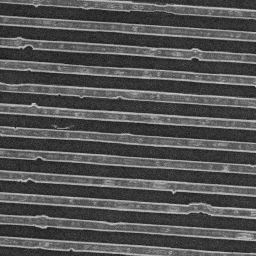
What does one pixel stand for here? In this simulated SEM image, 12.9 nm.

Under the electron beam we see parallel lines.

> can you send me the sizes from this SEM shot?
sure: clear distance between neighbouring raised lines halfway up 176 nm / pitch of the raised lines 0.286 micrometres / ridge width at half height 8.73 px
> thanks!